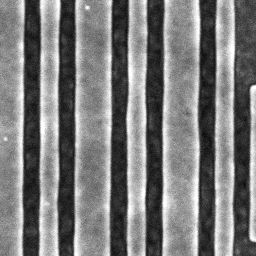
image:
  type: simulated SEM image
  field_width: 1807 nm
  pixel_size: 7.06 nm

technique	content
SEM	groups of lines, slits or small figures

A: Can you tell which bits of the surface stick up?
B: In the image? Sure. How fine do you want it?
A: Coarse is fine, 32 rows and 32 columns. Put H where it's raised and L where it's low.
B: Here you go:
HHHLLHHLLLHHHHLLHHLLLHHHHLLHHLLL
HHHLLHHLLLHHHHLLHHLLLHHHHLLHHLLL
HHHLLHHLLLHHHHLLHHLLLHHHHLLHHLLL
HHHLLHHLLLHHHHLLHHLLLHHHHLLHHLLL
HHHLLHHLLLHHHHLLHHLLLHHHHLLHHLLL
HHHLLHHLLLHHHHLLHHLLLHHHHLLHHLLL
HHHLLHHLLLHHHHLLHHLLLHHHHLLHHLLL
HHHLLHHLLLHHHHLLHHLLLHHHHLLHHLLL
HHHLLHHLLLHHHHLLHHLLLHHHHLLHHLLL
HHHLLHHLLLHHHHLLHHLLLHHHHLLHHLLL
HHHLLHHLLLHHHHLLHHLLLHHHHLLHHLLL
HHHLLHHLLLHHHHLLHHLLLHHHHLLHHLLH
HHHLLHHLLLHHHHLLHHLLHHHHHLLHHLLH
HHHLLHHLLLHHHHLLHHLLHHHHHLLHHLLH
HHHLLHHLLLHHHHLLHHLLHHHHHLLHHLLH
HHHLLHHLLLHHHHLLHHLLHHHHHLLHHLLH
HHHLLHHLLLHHHHLLHHLLHHHHHLLHHLLH
HHHLLHHLLLHHHHLLHHLLHHHHHLLHHLLH
HHHLLHHLLLHHHHLLHHLLHHHHHLLHHLLH
HHHLLHHLLLHHHHLLHHLLHHHHHLLHHLLH
HHHLLHHLLHHHHHLLHHLLHHHHHLLHHLLH
HHHLLHHLLHHHHHLLHHLLHHHHHLLHHLLH
HHHLLHHLLHHHHHLLHHLLHHHHHLLHHLLH
HHHLLHHLLHHHHHLLHHLLHHHHHLLHHLLH
HHHLLHHLLHHHHHLLHHLLHHHHHLLHHLLH
HHHLLHHLLHHHHHLLHHLLHHHHHLLHHLLH
HHHLLHHLLHHHHHLLHHLLHHHHHLLHHLLH
HHHLLHHLLHHHHHLLHHLLHHHHHLLHHLLH
HHHLLHHLLHHHHHLLHHLLHHHHHLLHHLLH
HHHLLHHLLHHHHHLLHHLLHHHHHLLHHLLH
HHHLLHHLLHHHHHLLHHLLHHHHHLLHHLLL
HHHLLHHLLHHHHHLLHHLLHHHHHLLHHLLL